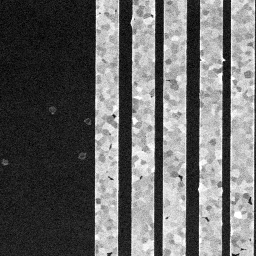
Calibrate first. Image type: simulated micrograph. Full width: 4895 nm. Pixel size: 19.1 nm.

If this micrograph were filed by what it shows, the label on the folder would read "parallel lines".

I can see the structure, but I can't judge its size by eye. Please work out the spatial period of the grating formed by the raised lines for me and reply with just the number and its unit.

646 nm